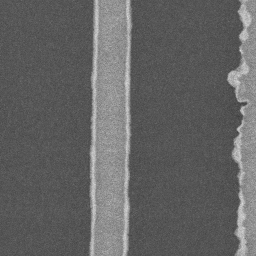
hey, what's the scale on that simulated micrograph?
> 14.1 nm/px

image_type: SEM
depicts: one or a few lines or trenches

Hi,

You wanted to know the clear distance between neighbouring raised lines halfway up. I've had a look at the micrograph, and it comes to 1620 nanometers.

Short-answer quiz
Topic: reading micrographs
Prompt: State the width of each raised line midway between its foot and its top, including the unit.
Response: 32.4 pixels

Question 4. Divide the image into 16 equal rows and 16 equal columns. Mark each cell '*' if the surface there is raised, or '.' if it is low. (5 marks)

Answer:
......**.......*
......**.......*
......**.......*
......**.......*
......**.......*
......**.......*
......**.......*
......**.......*
......**.......*
......**.......*
......**.......*
......**.......*
......**.......*
......**.......*
......**.......*
......**.......*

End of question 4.